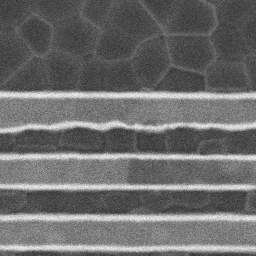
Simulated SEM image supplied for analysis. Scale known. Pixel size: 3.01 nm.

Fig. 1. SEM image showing one or a few lines or trenches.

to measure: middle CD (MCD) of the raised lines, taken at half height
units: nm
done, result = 93.4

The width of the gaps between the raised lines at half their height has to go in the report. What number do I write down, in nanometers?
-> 90.7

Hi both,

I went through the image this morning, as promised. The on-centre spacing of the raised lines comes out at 184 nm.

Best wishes